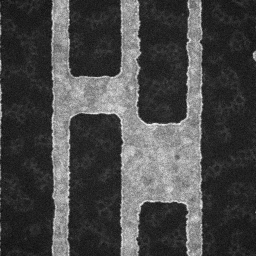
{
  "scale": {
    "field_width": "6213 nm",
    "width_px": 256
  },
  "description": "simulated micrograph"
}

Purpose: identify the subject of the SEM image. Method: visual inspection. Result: one or a few lines or trenches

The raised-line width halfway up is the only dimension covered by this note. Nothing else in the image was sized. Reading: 376 nm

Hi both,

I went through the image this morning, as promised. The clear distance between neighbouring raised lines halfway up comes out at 51.9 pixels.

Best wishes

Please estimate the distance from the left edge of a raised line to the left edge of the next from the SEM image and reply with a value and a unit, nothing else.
1.62 um